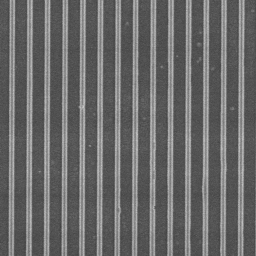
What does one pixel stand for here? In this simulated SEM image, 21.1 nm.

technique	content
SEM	parallel lines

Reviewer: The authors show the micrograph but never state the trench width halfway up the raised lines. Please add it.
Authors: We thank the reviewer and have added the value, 310 nm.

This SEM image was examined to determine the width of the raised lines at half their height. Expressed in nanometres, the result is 73.7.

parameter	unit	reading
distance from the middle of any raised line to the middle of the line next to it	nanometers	371